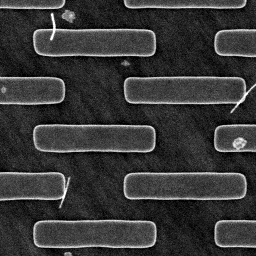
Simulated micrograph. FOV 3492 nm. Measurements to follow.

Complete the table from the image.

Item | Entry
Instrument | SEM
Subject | groups of lines, slits or small figures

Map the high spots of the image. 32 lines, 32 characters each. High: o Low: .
oooooooo........ooooooooooooooo.
........o.......................
........o.......................
................................
....ooooooooooooooo........ooooo
....ooooooooooooooo........ooooo
.....oooooooooooooo........ooooo
................................
................................
................................
oooooooo........ooooooooooooooo.
oooooooo........ooooooooooooooo.
oooooooo........oooooooooooooo..
................................
................................
................................
....ooooooooooooooo........ooooo
....ooooooooooooooo........ooooo
.....oooooooooooooo........ooooo
................................
................................
................................
oooooooo........ooooooooooooooo.
oooooooo........ooooooooooooooo.
oooooooo........oooooooooooooo..
................................
................................
................................
....ooooooooooooooo........ooooo
....ooooooooooooooo........ooooo
.....oooooooooooooo........ooooo
................................